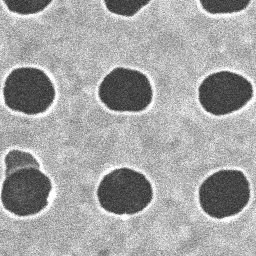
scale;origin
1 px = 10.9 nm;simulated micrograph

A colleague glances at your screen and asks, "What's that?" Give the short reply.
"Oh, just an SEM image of holes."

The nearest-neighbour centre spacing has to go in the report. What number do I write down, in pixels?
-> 98.8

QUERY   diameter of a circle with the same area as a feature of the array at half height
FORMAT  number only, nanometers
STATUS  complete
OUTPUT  552